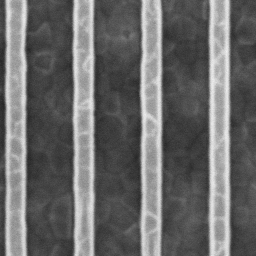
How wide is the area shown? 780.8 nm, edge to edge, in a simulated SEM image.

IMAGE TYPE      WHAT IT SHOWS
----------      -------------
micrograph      one or a few lines or trenches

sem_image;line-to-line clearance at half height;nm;155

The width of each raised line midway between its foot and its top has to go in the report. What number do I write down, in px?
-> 16.7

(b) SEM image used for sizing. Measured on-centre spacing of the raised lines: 207 nm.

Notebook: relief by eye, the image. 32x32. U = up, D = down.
DUUDDDDDDUUUDDDDDDUUDDDDDDUUDDDD
DUUDDDDDDUUUDDDDDDUUDDDDDDUUDDDD
DUUDDDDDDUUDDDDDDDUUDDDDDDUUDDDD
DUUDDDDDDUUDDDDDDDUUDDDDDDUUDDDD
DUUDDDDDDUUDDDDDDDUUDDDDDDUUDDDD
DUUDDDDDDUUUDDDDDDUUDDDDDDUUDDDD
DUUDDDDDDUUUDDDDDDUUDDDDDDUUDDDD
DUUDDDDDDUUUDDDDDDUUDDDDDDUUDDDD
DUUDDDDDDUUUDDDDDDUUDDDDDDUUDDDD
DUUDDDDDDUUUDDDDDDUUDDDDDDUUDDDD
DUUDDDDDDUUDDDDDDDUUDDDDDDUUDDDD
DUUDDDDDDUUDDDDDDDUUDDDDDDUUDDDD
DUUDDDDDDUUDDDDDDDUUDDDDDDUUDDDD
DUUDDDDDDUUDDDDDDDUUDDDDDDUUDDDD
DUUDDDDDDUUDDDDDDDUUDDDDDDUUDDDD
DUUDDDDDDUUDDDDDDDUUDDDDDDUUDDDD
DUUDDDDDDUUDDDDDDDUUDDDDDDUUDDDD
DUUDDDDDDUUDDDDDDDUUDDDDDDUUDDDD
DUUDDDDDDUUDDDDDDDUUDDDDDDUUDDDD
DUUDDDDDDUUDDDDDDDUUDDDDDDUUDDDD
DUUDDDDDDUUDDDDDDDUUDDDDDDUUDDDD
DUUDDDDDDUUUDDDDDDUUDDDDDDUUDDDD
DUUDDDDDDUUDDDDDDDUUDDDDDDUUDDDD
DUUDDDDDDUUDDDDDDDUUDDDDDDUUDDDD
DUUDDDDDDUUDDDDDDDUUDDDDDDUUDDDD
DUUDDDDDDUUDDDDDDDUUDDDDDDUUDDDD
DUUDDDDDDUUUDDDDDDUUDDDDDDUUDDDD
DUUDDDDDDUUUDDDDDDUUDDDDDDUUDDDD
DUUDDDDDDUUUDDDDDDUUDDDDDDUUDDDD
DUUDDDDDDUUUDDDDDDUUDDDDDDUUDDDD
DUUDDDDDDDUUDDDDDDUUDDDDDDUUDDDD
DUUDDDDDDUUUDDDDDDUUDDDDDDUUDDDD